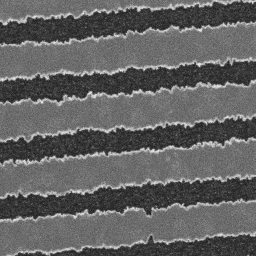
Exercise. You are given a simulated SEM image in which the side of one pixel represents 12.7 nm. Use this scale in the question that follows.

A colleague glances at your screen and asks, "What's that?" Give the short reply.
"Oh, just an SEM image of parallel lines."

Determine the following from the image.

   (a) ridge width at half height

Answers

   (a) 0.44 microns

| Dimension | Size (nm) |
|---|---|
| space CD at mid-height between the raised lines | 294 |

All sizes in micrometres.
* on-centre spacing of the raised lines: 0.739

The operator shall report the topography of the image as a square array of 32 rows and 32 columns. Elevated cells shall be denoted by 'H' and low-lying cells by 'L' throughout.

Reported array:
HHHHHHHHHHHHHHHHHHHHHHHHHHLLLLLL
HHHHHHHHHHHHLLLLLLLLLLLLLLLLLLLL
HHHLLLLLLLLLLLLLLLLLLLLLLLLLLLLL
LLLLLLLLLLLLLLLLLLLLLHLLLHHHHHHH
LLLLLLLLLLLLLLHHHHHHHHHHHHHHHHHH
LLLHHHHHHHHHHHHHHHHHHHHHHHHHHHHH
HHHHHHHHHHHHHHHHHHHHHHHHHHHHHHHH
HHHHHHHHHHHHHHHHHHHHHHHHHHHHHHHH
HHHHHHHHHHHHHHHHLHLLLHLLLLLLLLLL
HHHHLHLLLLLLLLLLLLLLLLLLLLLLLLLL
LLLLLLLLLLLLLLLLLLLLLLLLLLLLHLLH
LLLLLLLLLLLLLLLLLHLLHHHHHHHHHHHH
LLLHLHLLHHHHHHHHHHHHHHHHHHHHHHHH
HHHHHHHHHHHHHHHHHHHHHHHHHHHHHHHH
HHHHHHHHHHHHHHHHHHHHHHHHHHHHHHHH
HHHHHHHHHHHHHHHHHHHHHLLHLLLLLLLL
HHHHHHHHHLLLLLLLLLLLLLLLLLLLLLLL
HLLHLLLLLLLLLLLLLLLLLLLLLLLLLHLH
LLLLLLLLLLLLLLLLLLLLLHLLHHHHHHHH
LLLLLLLLLLLHHHHHHHHHHHHHHHHHHHHH
HHHHHHHHHHHHHHHHHHHHHHHHHHHHHHHH
HHHHHHHHHHHHHHHHHHHHHHHHHHHHHHHH
HHHHHHHHHHHHHHHHHHHHHHHHHHLLLLLL
HHHHHHHHHHHHLLHLLLLLLLLLLLLLLLLL
HLLLLLLLLLLLLLLLLLLLLLLLLLLLLLLL
LLLLLLLLLLLLLLLLLLLLLLLLLLHHHHHH
LLLLLLLLLLLLHHHHHHLHHHHHHHHHHHHH
HHHHHHHHHHHHHHHHHHHHHHHHHHHHHHHH
HHHHHHHHHHHHHHHHHHHHHHHHHHHHHHHH
HHHHHHHHHHHHHHHHHHHHHHHHHHHLHLLL
HHHHHHHHHHHHHHHHHLLLLLLLLLLLLLLL
HHHHLHHLLLLLLLLLLLLLLLLLLLLLLLLL